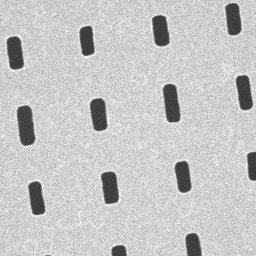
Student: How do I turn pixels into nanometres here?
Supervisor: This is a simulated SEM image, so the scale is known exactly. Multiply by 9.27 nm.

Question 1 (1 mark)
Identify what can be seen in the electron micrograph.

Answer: a regular array of holes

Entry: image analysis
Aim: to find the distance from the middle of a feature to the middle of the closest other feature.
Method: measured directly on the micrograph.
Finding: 681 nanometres